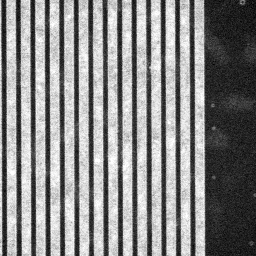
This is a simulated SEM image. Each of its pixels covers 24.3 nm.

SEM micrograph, parallel lines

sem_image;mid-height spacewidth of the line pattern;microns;0.194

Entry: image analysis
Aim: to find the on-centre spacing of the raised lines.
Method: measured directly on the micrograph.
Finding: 351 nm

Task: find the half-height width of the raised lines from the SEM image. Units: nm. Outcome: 158